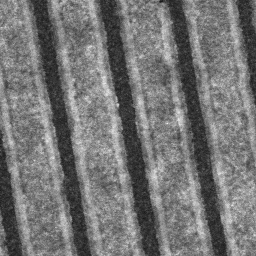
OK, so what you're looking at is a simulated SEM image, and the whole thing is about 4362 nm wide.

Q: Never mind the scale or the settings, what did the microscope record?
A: one or a few lines or trenches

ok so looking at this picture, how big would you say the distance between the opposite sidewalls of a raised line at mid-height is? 625 nanometres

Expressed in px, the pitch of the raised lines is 67.2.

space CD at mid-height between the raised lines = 514 nm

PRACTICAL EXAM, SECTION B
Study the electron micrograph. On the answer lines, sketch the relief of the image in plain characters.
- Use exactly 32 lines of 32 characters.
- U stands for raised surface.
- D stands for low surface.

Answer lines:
UUUDDDDUUUUDDDDUUUUDDDDDUUUUUDDD
UUUDDDDUUUUDDDDDUUUUDDDDUUUUUDDD
UUUDDDDUUUUUDDDDUUUUDDDDUUUUUDDD
UUUUDDDUUUUUDDDDUUUUUDDDUUUUUDDD
UUUUDDDDUUUUDDDDUUUUUDDDUUUUUDDD
UUUUDDDDUUUUDDDDUUUUUDDDDUUUUUDD
UUUUDDDDUUUUUDDDUUUUUDDDDUUUUUDD
UUUUDDDDUUUUUDDDDUUUUDDDDUUUUUDD
UUUUDDDDUUUUUDDDDUUUUUDDDUUUUUDD
UUUUUDDDUUUUUDDDDUUUUUDDDDUUUUDD
UUUUUDDDDUUUUDDDDUUUUUDDDDUUUUDD
UUUUUDDDDUUUUDDDDUUUUUDDDDUUUUUD
UUUUUDDDDUUUUUDDDDUUUUDDDDUUUUUD
DUUUUDDDDUUUUUDDDDUUUUDDDDUUUUUD
DUUUUUDDDUUUUUDDDDUUUUUDDDUUUUUD
DUUUUUDDDDUUUUDDDDUUUUUDDDDUUUUD
DUUUUUDDDDUUUUDDDDUUUUUDDDDUUUUU
DUUUUUDDDDUUUUDDDDUUUUUDDDDUUUUU
DDUUUUDDDDUUUUUDDDDUUUUDDDDUUUUU
DDUUUUDDDDUUUUUDDDDUUUUDDDDUUUUU
DDUUUUUDDDUUUUUDDDDUUUUDDDDUUUUU
DDUUUUUDDDDUUUUDDDDUUUUUDDDDUUUU
DDUUUUUDDDDUUUUDDDDUUUUUDDDDUUUU
DDUUUUUDDDDUUUUDDDDDUUUUDDDDUUUU
DDUUUUUDDDDUUUUUDDDDUUUUDDDDUUUU
DDDUUUUUDDDUUUUUDDDDUUUUUDDDUUUU
DDDUUUUUDDDUUUUUDDDDUUUUUDDDUUUU
DDDUUUUUDDDDUUUUDDDDUUUUUDDDDUUU
DDDUUUUUDDDDUUUUDDDDUUUUUDDDDUUU
DDDUUUUUDDDDUUUUUDDDDUUUUDDDDUUU
DDDDUUUUDDDDUUUUUDDDDUUUUDDDDUUU
DDDDUUUUUDDDUUUUUDDDDUUUUUDDDUUU